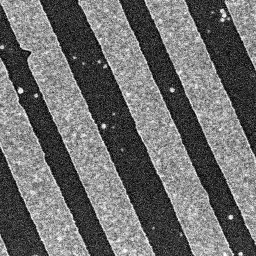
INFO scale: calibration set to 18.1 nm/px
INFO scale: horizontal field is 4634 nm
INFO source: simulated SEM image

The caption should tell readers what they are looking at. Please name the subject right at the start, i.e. one or a few lines or trenches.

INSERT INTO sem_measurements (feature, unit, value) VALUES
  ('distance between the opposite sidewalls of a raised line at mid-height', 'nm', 625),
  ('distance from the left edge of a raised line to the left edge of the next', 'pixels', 65.2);